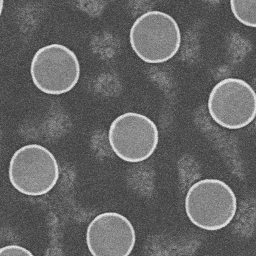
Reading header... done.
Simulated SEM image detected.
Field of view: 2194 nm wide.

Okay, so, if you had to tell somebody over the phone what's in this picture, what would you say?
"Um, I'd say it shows raised bodies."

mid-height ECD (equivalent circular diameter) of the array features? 411 nm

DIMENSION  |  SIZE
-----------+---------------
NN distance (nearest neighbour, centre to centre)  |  103 pixels